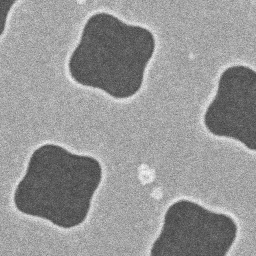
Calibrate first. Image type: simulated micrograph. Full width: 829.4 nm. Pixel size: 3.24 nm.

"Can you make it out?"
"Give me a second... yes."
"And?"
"holes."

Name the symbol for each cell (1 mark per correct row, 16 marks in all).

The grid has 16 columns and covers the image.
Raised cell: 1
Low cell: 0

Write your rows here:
0111111111111111
1111100011111111
1111100000111111
1111000001111111
1111000001111100
1111110001111100
1111111111111000
1111111111111000
1111111111111100
1100111111111111
1100001111111111
1000001111111111
1000001111111111
1100011111000011
1111111111000001
1111111110000011